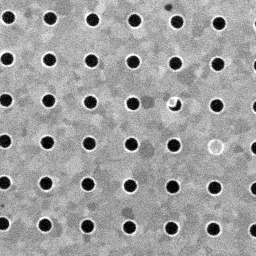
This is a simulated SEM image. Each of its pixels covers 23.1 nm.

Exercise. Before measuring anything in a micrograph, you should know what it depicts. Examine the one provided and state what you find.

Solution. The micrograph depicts a regular array of holes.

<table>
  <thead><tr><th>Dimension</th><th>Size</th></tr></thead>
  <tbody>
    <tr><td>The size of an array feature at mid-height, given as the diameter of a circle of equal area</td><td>325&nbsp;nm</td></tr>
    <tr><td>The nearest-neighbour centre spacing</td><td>952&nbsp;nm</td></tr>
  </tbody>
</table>